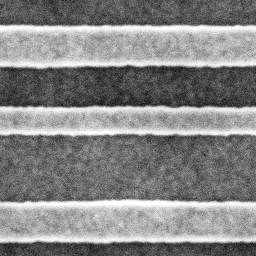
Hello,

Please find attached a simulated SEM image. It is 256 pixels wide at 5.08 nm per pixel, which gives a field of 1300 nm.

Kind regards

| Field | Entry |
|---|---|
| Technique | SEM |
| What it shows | lines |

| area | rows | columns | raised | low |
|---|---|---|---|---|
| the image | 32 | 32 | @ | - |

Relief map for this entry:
--------------------------------
--------------------------------
--------------------------------
@@@@@@@@@@@@@@@@@@@@@@@@@@@@@@@@
@@@@@@@@@@@@@@@@@@@@@@@@@@@@@@@@
@@@@@@@@@@@@@@@@@@@@@@@@@@@@@@@@
@@@@@@@@@@@@@@@@@@@@@@@@@@@@@@@@
@@@@@@@@@@@@@@@@@@@@@@@@@@@@@@@@
--------------------------------
--------------------------------
--------------------------------
--------------------------------
--------------------------------
@@@@@@-----@@@@@@@@@@--@-@@-----
@@@@@@@@@@@@@@@@@@@@@@@@@@@@@@@@
@@@@@@@@@@@@@@@@@@@@@@@@@@@@@@@@
@@@@@@@@@@@@@@@@@@@@@@@@@@@@@@@@
--------------------------------
--------------------------------
--------------------------------
--------------------------------
--------------------------------
--------------------------------
--------------------------------
--------------------------------
@@-@@@@@@@@@@@@@@@@@@@@@@@@@@@@@
@@@@@@@@@@@@@@@@@@@@@@@@@@@@@@@@
@@@@@@@@@@@@@@@@@@@@@@@@@@@@@@@@
@@@@@@@@@@@@@@@@@@@@@@@@@@@@@@@@
@@@@@@@@@@@@@@@@@@@@@@@@@@@@@@@@
--------------------------------
--------------------------------